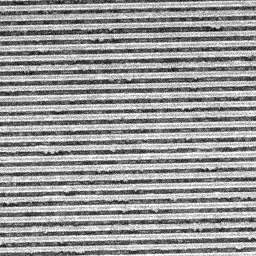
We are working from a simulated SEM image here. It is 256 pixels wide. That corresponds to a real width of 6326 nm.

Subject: parallel lines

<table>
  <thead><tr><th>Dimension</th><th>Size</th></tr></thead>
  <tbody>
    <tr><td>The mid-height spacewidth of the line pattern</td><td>139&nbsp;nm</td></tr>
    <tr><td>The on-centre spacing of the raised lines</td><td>0.249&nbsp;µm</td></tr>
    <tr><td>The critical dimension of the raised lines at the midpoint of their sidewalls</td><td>117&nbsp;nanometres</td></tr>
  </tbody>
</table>